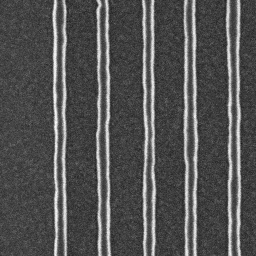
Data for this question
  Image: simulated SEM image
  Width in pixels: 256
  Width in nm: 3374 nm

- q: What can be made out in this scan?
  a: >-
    parallel lines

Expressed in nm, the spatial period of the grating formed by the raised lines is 573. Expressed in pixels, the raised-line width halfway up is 8.87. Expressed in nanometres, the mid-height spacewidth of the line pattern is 450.